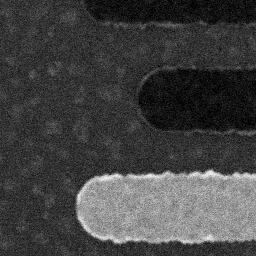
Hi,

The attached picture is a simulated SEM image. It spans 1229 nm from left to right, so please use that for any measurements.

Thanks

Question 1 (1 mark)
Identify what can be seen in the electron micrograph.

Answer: one or a few lines or trenches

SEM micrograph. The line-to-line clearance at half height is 204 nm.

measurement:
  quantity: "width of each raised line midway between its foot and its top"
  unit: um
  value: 0.317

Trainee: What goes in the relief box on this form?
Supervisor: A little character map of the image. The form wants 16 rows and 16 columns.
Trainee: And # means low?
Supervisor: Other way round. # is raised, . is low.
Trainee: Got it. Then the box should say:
.....###########
.......#####.###
................
................
..........######
.........#######
.........#######
.........#######
................
................
................
.....###########
.....###########
.....###########
......##########
................